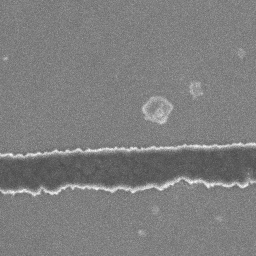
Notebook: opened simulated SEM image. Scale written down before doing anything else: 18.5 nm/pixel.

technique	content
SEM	one or a few lines or trenches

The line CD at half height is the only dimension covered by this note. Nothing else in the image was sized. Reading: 38.9 pixels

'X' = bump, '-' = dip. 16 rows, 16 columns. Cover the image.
----------------
----------------
----------------
----------------
----------------
----------------
----------------
----------------
----------------
---XXXXXXXXXXXXX
XXXXXXXXXXXXXXXX
XXXXXXXXXXX--XXX
----------------
----------------
----------------
----------------